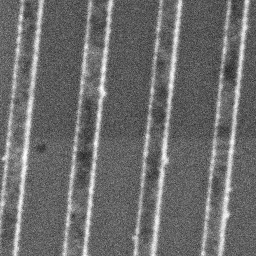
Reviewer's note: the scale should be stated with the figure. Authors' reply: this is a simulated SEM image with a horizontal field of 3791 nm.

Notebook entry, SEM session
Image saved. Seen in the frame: lines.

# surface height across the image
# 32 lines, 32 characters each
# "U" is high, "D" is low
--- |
DDDUUDDDDDDUUUDDDDDDUUUDDDDDDUUD
DDDUUDDDDDDUUUDDDDDDUUDDDDDDDUUD
DDDUUDDDDDDUUUDDDDDDUUDDDDDDUUUD
DDUUUDDDDDDUUUDDDDDDUUDDDDDDUUDD
DDUUUDDDDDDUUDDDDDDDUUDDDDDDUUDD
DDUUUDDDDDDUUDDDDDDDUUDDDDDDUUDD
DDUUUDDDDDDUUDDDDDDUUUDDDDDDUUDD
DDUUDDDDDDDUUDDDDDDUUUDDDDDDUUDD
DDUUDDDDDDUUUDDDDDDUUUDDDDDDUUDD
DDUUDDDDDDUUUDDDDDDUUUDDDDDDUUDD
DDUUDDDDDDUUUDDDDDDUUDDDDDDDUUDD
DDUUDDDDDDUUUDDDDDDUUDDDDDDDUUDD
DDUUDDDDDDUUUDDDDDDUUDDDDDDUUUDD
DUUUDDDDDDUUUDDDDDDUUDDDDDDUUDDD
DUUUDDDDDDUUDDDDDDDUUDDDDDDUUDDD
DUUUDDDDDDUUDDDDDDDUUDDDDDDUUDDD
DUUDDDDDDDUUDDDDDDUUUDDDDDDUUDDD
DUUDDDDDDUUUDDDDDDUUUDDDDDDUUDDD
DUUDDDDDDUUUDDDDDDUUUDDDDDDUUDDD
DUUDDDDDDUUUDDDDDDUUUDDDDDDUUDDD
DUUDDDDDDUUUDDDDDDUUDDDDDDDUUDDD
DUUDDDDDDUUUDDDDDDUUDDDDDDUUUDDD
UUUDDDDDDUUUDDDDDDUUDDDDDDUUUDDD
UUUDDDDDDUUDDDDDDDUUDDDDDDUUUDDD
UUUDDDDDDUUDDDDDDDUUDDDDDDUUDDDD
UUUDDDDDDUUDDDDDDDUUDDDDDDUUDDDD
UUUDDDDDDUUDDDDDDUUUDDDDDDUUDDDD
UUDDDDDDUUUDDDDDDUUUDDDDDDUUDDDD
UUDDDDDDUUUDDDDDDUUUDDDDDDUUDDDD
UUDDDDDDUUUDDDDDDUUDDDDDDDUUDDDD
UUDDDDDDUUUDDDDDDUUDDDDDDUUUDDDD
UUDDDDDDUUUDDDDDDUUDDDDDDUUUDDDD